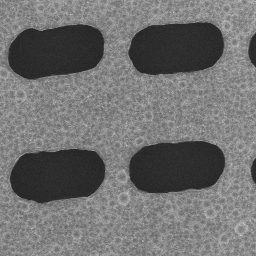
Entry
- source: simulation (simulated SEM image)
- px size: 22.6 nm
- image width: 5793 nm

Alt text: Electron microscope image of holes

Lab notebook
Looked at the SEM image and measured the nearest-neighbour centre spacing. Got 2690 nm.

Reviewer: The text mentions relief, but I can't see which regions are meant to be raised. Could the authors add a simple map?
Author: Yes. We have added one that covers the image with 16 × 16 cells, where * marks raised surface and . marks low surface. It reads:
****************
***********..***
*.....**......**
*.....**......**
*....****...****
****************
****************
****************
****************
**....***.....**
*......*......**
*.....**.....***
**..************
****************
****************
****************